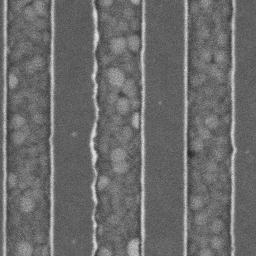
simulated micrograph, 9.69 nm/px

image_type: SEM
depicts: one or a few lines or trenches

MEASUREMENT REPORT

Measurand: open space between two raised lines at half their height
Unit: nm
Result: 453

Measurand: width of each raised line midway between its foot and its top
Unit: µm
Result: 0.418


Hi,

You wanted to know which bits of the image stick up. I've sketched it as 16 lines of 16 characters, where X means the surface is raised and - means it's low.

---XXX---XXX---X
---XXX---XXX---X
---XXX---XXX---X
---XXX---XXX---X
---XXX---XXX---X
---XXX---XXX---X
---XXX---XXX---X
---XXX---XXX---X
---XXX---XXX---X
---XXX---XXX---X
---XXX---XXX---X
---XXX---XXX---X
---XXX---XXX---X
---XXX---XXX---X
---XXX---XXX---X
---XXX---XXX---X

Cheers